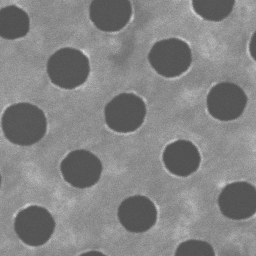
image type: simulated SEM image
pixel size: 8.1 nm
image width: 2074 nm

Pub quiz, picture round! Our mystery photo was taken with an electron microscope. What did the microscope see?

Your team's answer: a regular array of holes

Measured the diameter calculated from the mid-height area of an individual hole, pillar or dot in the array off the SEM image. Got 329 nanometres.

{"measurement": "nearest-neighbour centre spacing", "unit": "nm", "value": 577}